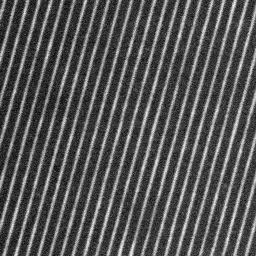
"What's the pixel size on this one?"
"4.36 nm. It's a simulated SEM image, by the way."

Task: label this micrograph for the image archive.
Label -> parallel lines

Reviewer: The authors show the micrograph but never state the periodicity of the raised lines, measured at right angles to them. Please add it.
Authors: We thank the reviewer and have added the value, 48.5 nanometers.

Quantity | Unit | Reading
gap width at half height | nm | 39.4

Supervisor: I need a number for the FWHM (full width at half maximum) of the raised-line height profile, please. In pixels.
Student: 2.06